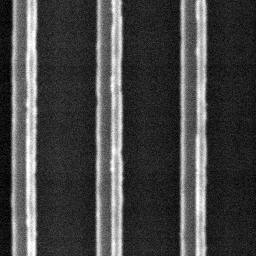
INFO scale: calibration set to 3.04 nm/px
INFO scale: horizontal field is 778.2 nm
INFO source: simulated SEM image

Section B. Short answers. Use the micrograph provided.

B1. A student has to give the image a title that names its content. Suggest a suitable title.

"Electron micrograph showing lines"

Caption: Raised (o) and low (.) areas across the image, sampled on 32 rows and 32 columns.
..ooo.......ooo........ooo......
..ooo.......ooo........ooo......
..ooo.......ooo........ooo......
..ooo.......ooo........ooo......
..oo........ooo........ooo......
..oo........ooo........ooo......
..oo........ooo........ooo......
..oo........ooo........ooo......
..oo........ooo........ooo......
..oo........ooo........ooo......
..ooo.......ooo........ooo......
..ooo.......ooo........ooo......
..oo........ooo........ooo......
..oo........ooo........ooo......
..oo........ooo........ooo......
..oo........ooo........ooo......
..oo........ooo........ooo......
..oo........ooo........ooo......
..oo........ooo........ooo......
..oo........ooo........ooo......
..oo........ooo........ooo......
..oo........ooo........ooo......
..oo........ooo........ooo......
..oo........ooo........ooo......
..oo........ooo........ooo......
..oo........ooo........ooo......
..oo........ooo........ooo......
..oo........ooo........ooo......
..oo........ooo........ooo......
..oo........ooo........ooo......
..oo........ooo........ooo......
..oo........ooo........ooo......